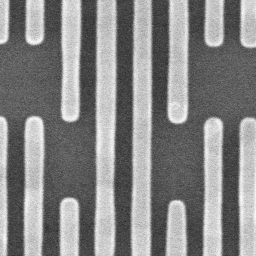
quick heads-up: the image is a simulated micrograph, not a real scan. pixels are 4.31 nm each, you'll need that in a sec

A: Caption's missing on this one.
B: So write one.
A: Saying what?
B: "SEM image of wiring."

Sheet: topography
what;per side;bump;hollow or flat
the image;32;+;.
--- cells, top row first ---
+..++...++..++...++..++...++..++
+..++...++..++...++..++...++..++
+..++...++..++...++..++...++..++
+..++...++..++...++..++...++..++
+..++...++..++...++..++...++..++
........++..++...++..++...+...++
........++..++...++..++.........
........++..++...++..++.........
........++..++...++..++.........
........++..++...++..++.........
........++..++...++..++.........
........++..++...++..++.........
........++..++...++..++.........
........++..++...++..++.........
........++..++...++..++.........
+..++.......++...++.......++..++
+..++.......++...++.......++..++
+..++.......++...++.......++..++
+..++.......++...++.......++..++
+..++.......++...++.......++..++
+..++.......++...++.......++..++
+..++.......++...++.......++..++
+..++.......++...++.......++..++
+..++.......++...++.......++..++
+..++.......++...++.......++..++
+..++...++..++...++..++...++..++
+..++...++..++...++..++...++..++
+..++...++..++...++..++...++..++
+..++...++..++...++..++...++..++
+..++...++..++...++..++...++..++
+..++...++..++...++..++...++..++
+..++...++..++...++..++...++..++